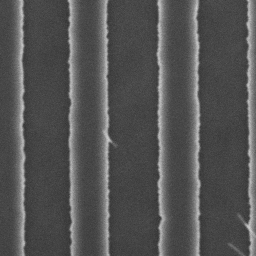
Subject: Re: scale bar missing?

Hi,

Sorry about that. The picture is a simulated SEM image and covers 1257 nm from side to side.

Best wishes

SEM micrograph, lines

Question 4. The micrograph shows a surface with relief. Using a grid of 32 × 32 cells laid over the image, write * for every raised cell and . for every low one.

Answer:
***......****.......*****......*
***......****.......*****......*
***......****.......*****......*
***......****.......*****......*
***......****.......*****......*
***......****.......*****......*
***......****.......*****......*
***......****.......*****......*
***......****.......*****......*
***......****.......*****......*
***......****.......*****......*
***......****.......*****......*
***......****.......*****......*
***......****.......*****......*
***......*****......*****......*
***......*****......*****......*
***......****.......*****......*
***......*****......*****......*
***......*****......*****......*
***......*****......*****......*
***......*****......*****......*
***......*****......*****......*
***......****.......*****......*
***......*****......*****......*
***......*****......*****......*
***......*****......*****......*
***......*****......*****......*
***......*****......*****......*
***......*****......*****......*
***......*****......*****......*
***......*****......*****......*
***......*****......*****......*